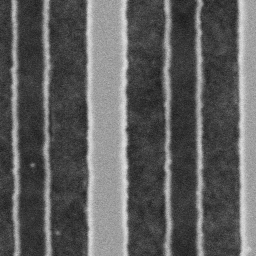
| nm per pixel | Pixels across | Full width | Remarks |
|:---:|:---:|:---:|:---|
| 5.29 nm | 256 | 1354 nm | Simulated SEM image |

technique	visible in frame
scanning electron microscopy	lines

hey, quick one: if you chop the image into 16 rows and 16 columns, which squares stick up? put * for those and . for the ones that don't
.**..***..***..*
.**..***..**...*
.**..***..**...*
.**..***..***..*
.**..***..**...*
.**..***..**...*
.**...**..**...*
.**...**..***..*
.**...**..***..*
.**...**..***..*
.**...**..***..*
.**...**..***..*
.**...**..***..*
.**...**..***..*
.**...**..***..*
.**...**..***..*